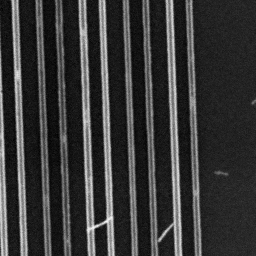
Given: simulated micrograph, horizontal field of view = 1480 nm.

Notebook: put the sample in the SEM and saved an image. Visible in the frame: parallel lines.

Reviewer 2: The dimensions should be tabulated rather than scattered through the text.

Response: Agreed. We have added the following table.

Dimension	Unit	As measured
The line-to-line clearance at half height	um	0.0881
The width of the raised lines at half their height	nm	27.4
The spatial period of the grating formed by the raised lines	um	0.125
